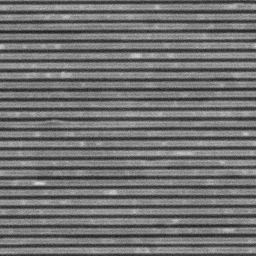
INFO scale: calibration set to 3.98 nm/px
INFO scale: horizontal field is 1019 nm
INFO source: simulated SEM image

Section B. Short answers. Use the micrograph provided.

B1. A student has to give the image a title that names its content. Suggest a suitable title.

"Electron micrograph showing parallel lines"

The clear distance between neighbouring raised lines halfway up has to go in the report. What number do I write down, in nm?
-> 18.9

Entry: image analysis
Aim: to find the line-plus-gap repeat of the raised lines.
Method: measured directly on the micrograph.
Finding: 38.7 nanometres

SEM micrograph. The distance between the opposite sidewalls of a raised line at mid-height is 19.4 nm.